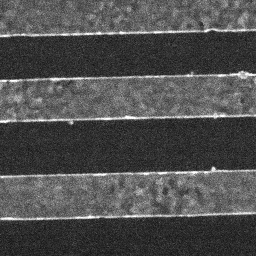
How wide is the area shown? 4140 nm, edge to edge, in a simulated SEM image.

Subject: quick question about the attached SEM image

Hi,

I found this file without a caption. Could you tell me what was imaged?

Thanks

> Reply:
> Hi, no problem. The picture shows one or a few lines or trenches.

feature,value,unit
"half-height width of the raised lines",697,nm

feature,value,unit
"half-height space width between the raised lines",770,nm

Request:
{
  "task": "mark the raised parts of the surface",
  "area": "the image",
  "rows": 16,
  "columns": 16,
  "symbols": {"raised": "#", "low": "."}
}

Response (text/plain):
################
################
................
................
................
################
################
####............
................
................
................
################
################
############....
................
................